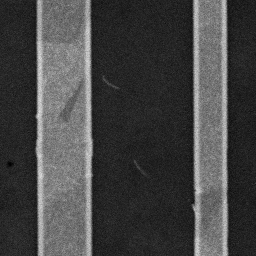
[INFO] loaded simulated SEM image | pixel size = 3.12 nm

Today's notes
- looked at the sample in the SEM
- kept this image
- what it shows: one or a few lines or trenches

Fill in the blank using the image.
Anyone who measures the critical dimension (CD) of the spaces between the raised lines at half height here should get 337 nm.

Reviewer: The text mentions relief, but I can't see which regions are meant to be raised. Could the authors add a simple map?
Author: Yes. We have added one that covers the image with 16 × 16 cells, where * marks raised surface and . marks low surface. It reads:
..***.......**..
..***.......**..
..***.......**..
..***.......**..
..***.......**..
...**.......**..
...**.......**..
..***.......**..
..****......**..
..****......**..
...***......**..
...***......**..
...***......**..
...***......**..
...***......**..
...***......**..